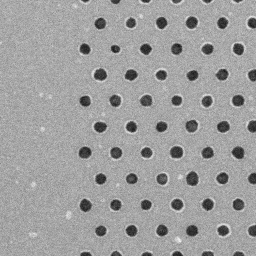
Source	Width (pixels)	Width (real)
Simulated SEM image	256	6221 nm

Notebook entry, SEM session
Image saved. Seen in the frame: a regular array of holes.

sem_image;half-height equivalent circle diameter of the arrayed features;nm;311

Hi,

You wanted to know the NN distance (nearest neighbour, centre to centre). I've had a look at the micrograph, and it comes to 722 nanometres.